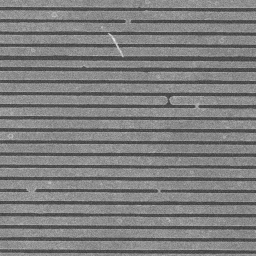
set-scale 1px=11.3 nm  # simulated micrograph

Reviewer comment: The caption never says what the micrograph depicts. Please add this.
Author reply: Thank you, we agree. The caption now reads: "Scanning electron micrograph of parallel lines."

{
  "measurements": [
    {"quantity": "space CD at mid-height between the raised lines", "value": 46.7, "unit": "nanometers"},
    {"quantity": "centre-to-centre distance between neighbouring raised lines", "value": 137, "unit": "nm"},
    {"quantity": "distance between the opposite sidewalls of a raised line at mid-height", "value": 93.5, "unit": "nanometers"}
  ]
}